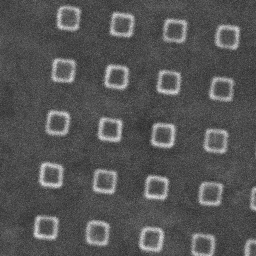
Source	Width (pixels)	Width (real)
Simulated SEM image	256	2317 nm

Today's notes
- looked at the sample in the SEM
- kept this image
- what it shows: a regular array of raised bodies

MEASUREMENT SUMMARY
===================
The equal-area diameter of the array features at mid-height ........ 0.202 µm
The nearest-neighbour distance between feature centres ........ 473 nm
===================